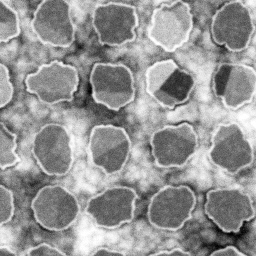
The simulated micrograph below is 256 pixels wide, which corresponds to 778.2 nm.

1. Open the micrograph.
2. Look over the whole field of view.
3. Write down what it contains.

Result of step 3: a regular array of raised bodies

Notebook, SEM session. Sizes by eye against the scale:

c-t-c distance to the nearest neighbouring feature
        174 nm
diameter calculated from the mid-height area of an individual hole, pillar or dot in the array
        0.138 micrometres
